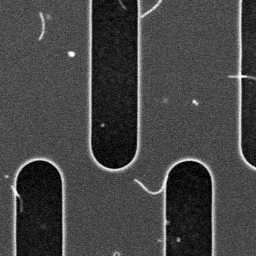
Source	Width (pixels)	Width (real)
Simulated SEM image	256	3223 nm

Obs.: groups of lines, slits or small figures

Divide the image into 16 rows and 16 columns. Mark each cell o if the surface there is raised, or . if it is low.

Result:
oooooo...oooooo.
oooooo...oooooo.
oooooo...oooooo.
oooooo...oooooo.
oooooo...oooooo.
oooooo...oooooo.
oooooo...oooooo.
oooooo...oooooo.
oooooo...oooooo.
oooooo..ooooooo.
o..oooo.ooo..ooo
o...oooooo...ooo
o...oooooo...ooo
o...oooooo...ooo
o...oooooo...ooo
o...oooooo...ooo